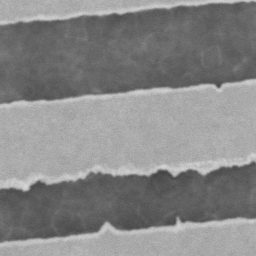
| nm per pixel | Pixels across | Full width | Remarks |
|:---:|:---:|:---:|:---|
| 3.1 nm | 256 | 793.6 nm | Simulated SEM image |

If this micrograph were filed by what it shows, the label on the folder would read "one or a few lines or trenches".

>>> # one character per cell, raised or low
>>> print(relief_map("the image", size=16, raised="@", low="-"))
@@@@@@@@@-------
----------------
----------------
----------------
----------------
------------@@@@
-@@@@@@@@@@@@@@@
@@@@@@@@@@@@@@@@
@@@@@@@@@@@@@@@@
@@@@@@@@@@@@@@@@
@@@@@@@@@@@@@---
@@--------------
----------------
----------------
------@@@@@@@@@@
@@@@@@@@@@@@@@@@